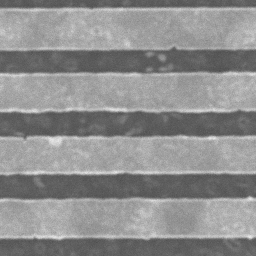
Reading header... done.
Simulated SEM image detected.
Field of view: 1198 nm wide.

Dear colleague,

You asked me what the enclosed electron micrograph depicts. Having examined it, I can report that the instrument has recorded one or a few lines or trenches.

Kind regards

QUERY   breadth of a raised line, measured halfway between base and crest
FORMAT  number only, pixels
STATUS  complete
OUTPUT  37.5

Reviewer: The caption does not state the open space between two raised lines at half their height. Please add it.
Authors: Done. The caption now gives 123 nm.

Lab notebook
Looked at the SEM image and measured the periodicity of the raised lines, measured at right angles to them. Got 0.295 µm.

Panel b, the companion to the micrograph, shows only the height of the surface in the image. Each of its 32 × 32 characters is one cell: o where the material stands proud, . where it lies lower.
................................
oooooooooooooooooooooooooooooooo
oooooooooooooooooooooooooooooooo
oooooooooooooooooooooooooooooooo
oooooooooooooooooooooooooooooooo
oooooooooooooooooooooooooooooooo
................................
................................
................................
oooooooooooooooooooooooooooooooo
oooooooooooooooooooooooooooooooo
oooooooooooooooooooooooooooooooo
oooooooooooooooooooooooooooooooo
oooooooooooooooooooooooooooooooo
................................
................................
................................
oooooooooooooooooooooooooooooooo
oooooooooooooooooooooooooooooooo
oooooooooooooooooooooooooooooooo
oooooooooooooooooooooooooooooooo
ooooooooooooooo.ooooooo..ooooooo
................................
................................
................................
oooooooooooooooooooooooooooooooo
oooooooooooooooooooooooooooooooo
oooooooooooooooooooooooooooooooo
oooooooooooooooooooooooooooooooo
oooooooooooooooooooooooooooooooo
................................
................................